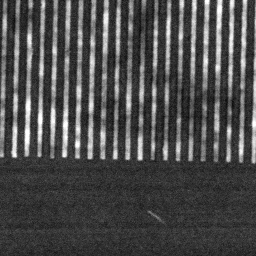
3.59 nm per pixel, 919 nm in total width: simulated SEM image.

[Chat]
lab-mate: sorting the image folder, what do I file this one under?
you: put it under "parallel lines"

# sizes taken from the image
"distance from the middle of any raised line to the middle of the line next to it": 0.0452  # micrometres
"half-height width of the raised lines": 15.2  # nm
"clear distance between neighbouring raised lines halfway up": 30.5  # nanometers